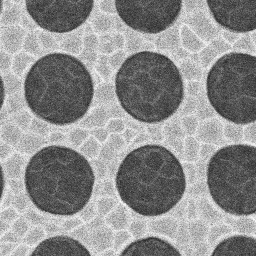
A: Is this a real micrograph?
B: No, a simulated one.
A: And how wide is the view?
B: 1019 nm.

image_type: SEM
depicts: holes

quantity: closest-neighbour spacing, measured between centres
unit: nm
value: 362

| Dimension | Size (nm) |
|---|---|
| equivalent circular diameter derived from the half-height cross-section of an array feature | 277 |